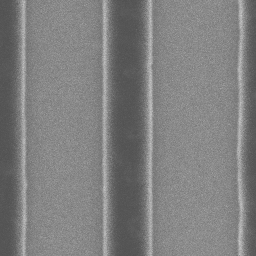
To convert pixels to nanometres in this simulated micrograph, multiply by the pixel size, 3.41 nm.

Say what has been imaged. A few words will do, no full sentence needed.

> one or a few lines or trenches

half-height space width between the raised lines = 281 nm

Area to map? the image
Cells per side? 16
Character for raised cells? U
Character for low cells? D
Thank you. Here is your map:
UUDDDDDUUDDDDDDU
UUDDDDDUUDDDDDDU
UUDDDDDUUDDDDDDU
UUDDDDDUUDDDDDDU
UUDDDDDUUDDDDDDU
UUDDDDDUUDDDDDDU
UUDDDDDUUDDDDDDU
UUDDDDDUUDDDDDDU
UUDDDDDUUDDDDDDU
UUDDDDDUUDDDDDDU
UUDDDDDUUDDDDDDU
UUDDDDUUUDDDDDDU
UUDDDDDUUDDDDDDU
UUDDDDDUUDDDDDDU
UUDDDDDUUDDDDDDU
UUDDDDDUUDDDDDDU